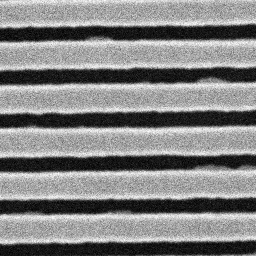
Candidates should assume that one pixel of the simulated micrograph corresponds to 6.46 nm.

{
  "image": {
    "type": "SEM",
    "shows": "lines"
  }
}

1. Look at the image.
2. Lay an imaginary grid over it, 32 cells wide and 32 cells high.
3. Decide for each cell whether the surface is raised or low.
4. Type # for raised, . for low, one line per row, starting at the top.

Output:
################################
################################
################################
................................
................................
################################
################################
################################
#################..##..#........
................................
......................##########
################################
################################
################################
................................
................................
################################
################################
################################
######...##.....................
................................
......##########################
################################
################################
################################
................................
................................
################################
################################
################################
................................
................................